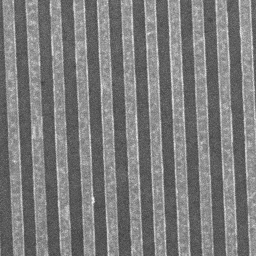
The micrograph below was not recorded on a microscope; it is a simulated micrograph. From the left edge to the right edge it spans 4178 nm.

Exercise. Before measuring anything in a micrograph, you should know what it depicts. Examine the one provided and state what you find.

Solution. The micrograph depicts parallel lines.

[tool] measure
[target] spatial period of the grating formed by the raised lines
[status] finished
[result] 386 nm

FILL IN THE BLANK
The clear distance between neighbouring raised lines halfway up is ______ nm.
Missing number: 212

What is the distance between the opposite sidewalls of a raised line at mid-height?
0.167 micrometres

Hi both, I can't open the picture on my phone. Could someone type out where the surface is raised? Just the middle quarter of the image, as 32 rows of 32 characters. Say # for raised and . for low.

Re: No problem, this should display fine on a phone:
...###...###...##....##....##...
...###...###...##....###...##...
...###...###...##....###...##...
...###...###...###...###...##...
...###...###...###...###...##...
...###...###...###...###...##...
...###...###...###...###...###..
...###....##...###...###...###..
....##....##...###...###...###..
....##....##...###....##...###..
....##....##...###...###...###..
....##....##....##....##...###..
....##....##....##...###...###..
....##....##....##...###...###..
....##....##....##...###....##..
....##....##....##....##....##..
....##....##....##....##...###..
....##....##....##....##...###..
....###...##....##....##....##..
#...###...##....##....##....##..
#...###...##....##....##....##..
#...###...##....##....##....##..
#...###...###...##....##....##..
#...###...###...##....##....##..
#...###...###...##....##....##..
#...###...###...##....###...##..
#...###...###...###...###...##..
#...###...###...###...###...##..
#...###...###...###...###...##..
#...###...###...###...###...###.
#...###...###...###...###...###.
#....##...###...###...###...###.